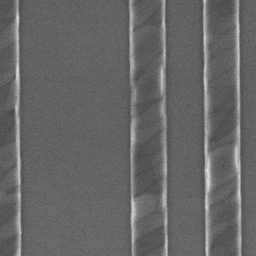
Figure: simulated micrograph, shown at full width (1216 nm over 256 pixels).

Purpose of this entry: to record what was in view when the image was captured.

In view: wiring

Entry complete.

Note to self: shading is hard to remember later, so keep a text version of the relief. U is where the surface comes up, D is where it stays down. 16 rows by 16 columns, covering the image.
UDDDDDDDUUDDDUUD
UDDDDDDDDDDDDUUD
UDDDDDDDUUDDDUUD
UDDDDDDDUUDDDUUD
UDDDDDDDUUDDDUUD
UDDDDDDDUUDDDUUD
UDDDDDDDUUDDDUUD
UDDDDDDDUUDDDUUD
UDDDDDDDUUDDDUUD
UDDDDDDDUUDDDUUD
UDDDDDDDUUDDDUUD
UDDDDDDDUUDDDUUD
UDDDDDDDUUDDDUUD
UDDDDDDDUUDDDUUD
UDDDDDDDUUDDDUUD
UDDDDDDDUUDDDUUD